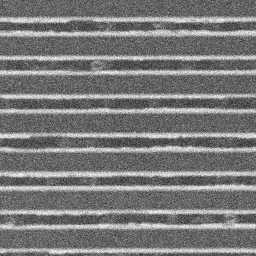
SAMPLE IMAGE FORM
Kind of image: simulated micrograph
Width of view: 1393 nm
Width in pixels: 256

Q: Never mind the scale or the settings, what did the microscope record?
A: parallel lines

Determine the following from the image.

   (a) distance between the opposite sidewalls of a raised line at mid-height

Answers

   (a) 16.6 px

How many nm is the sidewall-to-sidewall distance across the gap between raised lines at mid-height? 120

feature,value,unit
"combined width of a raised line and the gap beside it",0.21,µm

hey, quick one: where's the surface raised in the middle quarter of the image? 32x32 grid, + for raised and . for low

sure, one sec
++++++++++++++++++++++++++++++++
++++++++++++++++++++++++++++++++
................................
................................
................................
................................
................................
................................
++++++++++++++++++++++++++++++++
++++++++++++++++++++++++++++++++
++++++++++++++++++++++++++++++++
++++++++++++++++++++++++++++++++
................................
................................
................................
................................
................................
................................
++++++++++++++++++++++++++++++++
++++++++++++++++++++++++++++++++
++++++++++++++++++++++++++++++++
.++.............................
................................
................................
................................
................................
................................
++++++++++++++++++++++++++++++++
++++++++++++++++++++++++++++++++
++++++++++++++++++++++++++++++++
++++++++++++++++++++++++++++++++
................................